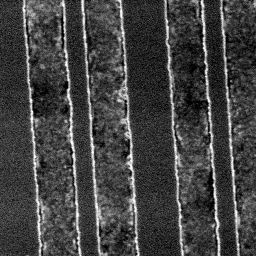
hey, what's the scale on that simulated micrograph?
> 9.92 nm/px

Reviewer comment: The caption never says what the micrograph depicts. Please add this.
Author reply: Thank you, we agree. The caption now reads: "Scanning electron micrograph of lines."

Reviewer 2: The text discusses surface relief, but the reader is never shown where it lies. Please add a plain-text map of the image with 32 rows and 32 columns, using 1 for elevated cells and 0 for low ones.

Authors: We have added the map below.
11100000110000011111100011111000
11100000111000011111100011111000
11100000111000011111100001110000
11111001111000011111100001110000
11100000111000011111100001110000
11110000111000111111100001110000
11100000111011111111100000110000
11110000111000101111100000110000
11110000111000011111100000110000
11110000111000001111100000110000
11110000011000001111100000110100
11110000011000011111100000111000
11110000011000011111110000111000
11110000011000011111110000111000
11110000011000001111110000111000
11110000011000001111111001111000
11110000011000001111111111111100
11110000011100001111111111111000
11110000011100001111110000111000
11110000011100001111110000011000
11110000011100001111110000111000
11110000011100001111110000011000
11111000011100000111110000011000
11111000011100000111110000011000
11111000001100000111110000011000
11111000011100000111110000011000
11111100001100001111111000011100
11111000001100000111111000011100
11111000001100000111111000011100
11111000001100000111111000011100
11111000111100000111111000011100
11111110001110000111111000011100